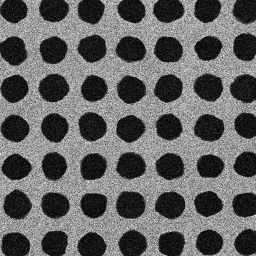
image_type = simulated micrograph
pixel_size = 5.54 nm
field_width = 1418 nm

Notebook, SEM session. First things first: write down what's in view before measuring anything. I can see a regular array of holes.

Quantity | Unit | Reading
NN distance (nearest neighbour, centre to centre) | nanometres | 210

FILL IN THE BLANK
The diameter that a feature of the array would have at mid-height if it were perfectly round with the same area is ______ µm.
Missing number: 0.149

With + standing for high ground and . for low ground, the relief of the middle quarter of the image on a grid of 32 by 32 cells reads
++++++++++++++++++++++++++++++++
++++++++++++++++++++++++++++++++
++++++++++++++++++++++++++++++++
++++++....+++++...++++++....++++
.++++.....++++......+++......+++
.+++.......+++......+++.......++
.+++.......++.......+++.......++
.++++.....+++.......+++......+++
+++++....+++++......++++.....+++
+++++++++++++++...+++++++.++++++
++++++++++++++++++++++++++++++++
++++++++++++++++++++++++++++++++
+++++...++++++++++++++++++.+++++
++++......+++++...++++++....++++
.+++......+++.......+++......+++
.+++.......++.......+++......+++
.+++.......++.......+++.......++
.+++......+++......+++++.....+++
+++++....+++++.....++++++...++++
++++++++++++++++.+++++++++++++++
++++++++++++++++++++++++++++++++
++++++++++++++++++++++++++++++++
+++++++.+++++++...+++++++..+++++
+++++.....++++.....+++++.....+++
+++++.....++++......+++.......++
.+++.......++.......+++.......++
.+++......+++.......+++.......++
++++......++++......++++......++
+++++....+++++++..+++++++...++++
++++++++++++++++++++++++++++++++
++++++++++++++++++++++++++++++++
++++++++++++++++++++++++++++++++